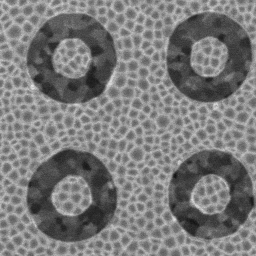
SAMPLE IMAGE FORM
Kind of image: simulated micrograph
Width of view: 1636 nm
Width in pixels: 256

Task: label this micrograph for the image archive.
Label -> ring-shaped raised bodies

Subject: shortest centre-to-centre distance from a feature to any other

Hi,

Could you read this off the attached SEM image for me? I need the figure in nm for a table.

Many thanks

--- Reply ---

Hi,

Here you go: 879